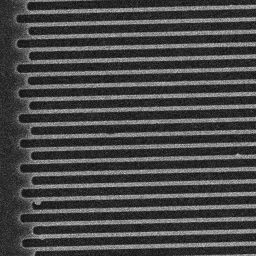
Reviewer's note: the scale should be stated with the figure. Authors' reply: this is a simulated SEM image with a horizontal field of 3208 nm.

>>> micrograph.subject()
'parallel lines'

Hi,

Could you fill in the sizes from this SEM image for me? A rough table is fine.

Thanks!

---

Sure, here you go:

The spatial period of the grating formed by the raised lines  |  156 nm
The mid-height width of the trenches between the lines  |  106 nm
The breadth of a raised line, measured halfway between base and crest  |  0.0423 microns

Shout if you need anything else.